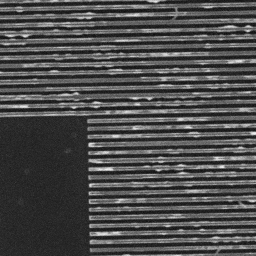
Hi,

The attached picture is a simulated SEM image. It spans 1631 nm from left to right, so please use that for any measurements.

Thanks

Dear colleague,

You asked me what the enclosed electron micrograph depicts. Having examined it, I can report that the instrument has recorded parallel lines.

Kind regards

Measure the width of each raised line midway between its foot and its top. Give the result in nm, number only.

22.3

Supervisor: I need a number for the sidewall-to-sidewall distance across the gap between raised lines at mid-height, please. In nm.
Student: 27.1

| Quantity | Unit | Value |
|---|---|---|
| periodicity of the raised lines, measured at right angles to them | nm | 51.4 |